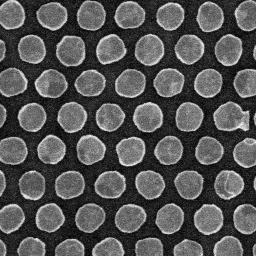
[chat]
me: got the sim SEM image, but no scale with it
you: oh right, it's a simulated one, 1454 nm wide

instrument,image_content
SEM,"a regular array of raised bodies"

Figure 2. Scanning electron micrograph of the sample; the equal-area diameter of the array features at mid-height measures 0.161 µm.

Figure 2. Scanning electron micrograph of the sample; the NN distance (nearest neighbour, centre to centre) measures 218 nm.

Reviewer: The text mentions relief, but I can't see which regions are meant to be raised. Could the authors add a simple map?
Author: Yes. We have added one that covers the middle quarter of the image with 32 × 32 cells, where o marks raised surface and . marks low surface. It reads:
................................
................oo.......ooo....
....ooooo.....oooooo....ooooo...
...ooooooo....oooooo...ooooooo..
o..ooooooo...ooooooo...ooooooo..
o..ooooooo...ooooooo...ooooooo..
...ooooooo...ooooooo...oooooo...
....ooooo.....ooooo.....oooo....
................................
................................
oooo.....oooo......oooo......ooo
ooooo....ooooo....oooooo....oooo
ooooo...ooooooo...oooooo....oooo
ooooo...ooooooo...oooooo....oooo
ooooo...ooooooo...oooooo....oooo
ooooo....ooooo....oooooo....oooo
oooo......ooo......ooo.......ooo
................................
.....ooo.........o.......ooo....
....ooooo.....oooooo....ooooo...
...ooooooo...ooooooo...oooooo...
...ooooooo...ooooooo...oooooo...
....oooooo...ooooooo...oooooo...
....ooooo.....ooooo....oooooo...
....oooo......ooooo.....oooo....
................................
................................
oooo......oooo.....oooo......ooo
ooooo....oooooo...ooooooo...oooo
ooooo...ooooooo...ooooooo...oooo
ooooo...ooooooo...ooooooo...oooo
ooooo...ooooooo....oooooo...oooo